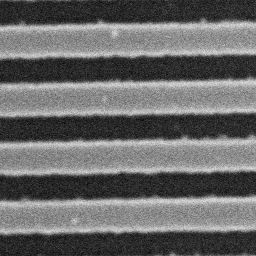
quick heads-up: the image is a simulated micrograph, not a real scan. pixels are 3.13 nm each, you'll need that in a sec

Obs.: lines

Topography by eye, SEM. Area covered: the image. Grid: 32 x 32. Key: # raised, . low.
................................
................................
................................
################################
################################
################################
################################
................................
................................
................................
........#..#####################
################################
################################
################################
.#..............................
................................
................................
...............................#
################################
################################
################################
###############...#.............
................................
................................
................................
################################
################################
################################
################################
................................
................................
................................